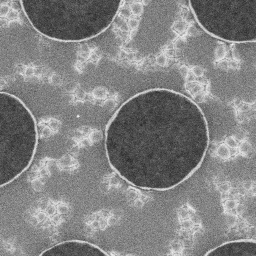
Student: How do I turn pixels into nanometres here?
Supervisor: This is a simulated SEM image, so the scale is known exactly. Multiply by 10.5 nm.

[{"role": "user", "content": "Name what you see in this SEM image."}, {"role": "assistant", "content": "raised bodies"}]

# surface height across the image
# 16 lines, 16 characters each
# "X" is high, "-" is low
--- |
-XXXXXX-----XXXX
--XXXXX-----XXXX
----X---------XX
----------------
----------------
----------------
X-------XXXX----
XX-----XXXXXX---
XX-----XXXXXX---
XX-----XXXXXX---
XX-----XXXXX----
--------XXX-----
----------------
----------------
----------------
---XXX-------XXX